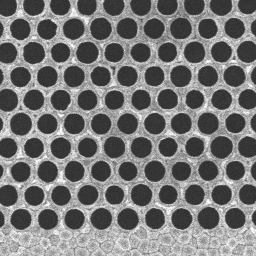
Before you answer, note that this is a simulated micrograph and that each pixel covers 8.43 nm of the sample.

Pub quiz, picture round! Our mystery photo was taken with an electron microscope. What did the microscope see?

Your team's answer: a regular array of holes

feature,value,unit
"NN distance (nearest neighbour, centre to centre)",224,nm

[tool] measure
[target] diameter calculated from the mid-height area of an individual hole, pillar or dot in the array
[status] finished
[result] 174 nm